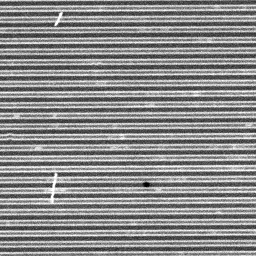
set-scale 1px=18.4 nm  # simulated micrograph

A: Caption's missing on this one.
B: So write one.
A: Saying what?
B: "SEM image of parallel lines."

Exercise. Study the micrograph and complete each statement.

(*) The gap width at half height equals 104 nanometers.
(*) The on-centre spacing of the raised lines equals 197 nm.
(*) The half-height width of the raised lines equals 89.9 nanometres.